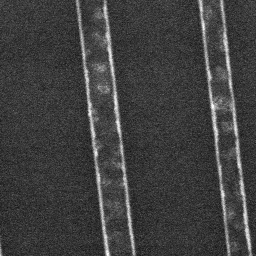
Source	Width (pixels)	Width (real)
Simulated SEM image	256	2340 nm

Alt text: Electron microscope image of one or a few lines or trenches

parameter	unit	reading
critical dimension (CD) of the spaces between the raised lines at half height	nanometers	858